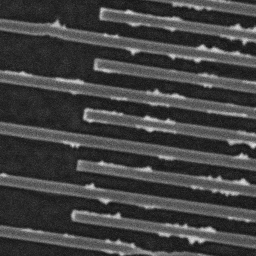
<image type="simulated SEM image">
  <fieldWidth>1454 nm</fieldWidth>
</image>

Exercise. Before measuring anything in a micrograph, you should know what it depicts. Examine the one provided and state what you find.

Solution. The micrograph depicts parallel lines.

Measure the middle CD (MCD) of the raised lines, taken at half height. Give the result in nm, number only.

66.7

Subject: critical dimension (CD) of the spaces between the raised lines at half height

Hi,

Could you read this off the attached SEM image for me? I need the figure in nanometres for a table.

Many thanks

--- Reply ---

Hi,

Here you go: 78.1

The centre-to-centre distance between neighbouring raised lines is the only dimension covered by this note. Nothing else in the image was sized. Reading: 145 nm